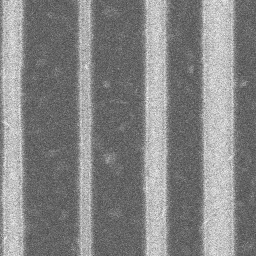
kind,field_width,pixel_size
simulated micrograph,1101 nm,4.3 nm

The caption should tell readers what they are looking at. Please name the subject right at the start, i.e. one or a few lines or trenches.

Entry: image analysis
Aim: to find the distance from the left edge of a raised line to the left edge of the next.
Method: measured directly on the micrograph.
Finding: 0.288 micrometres